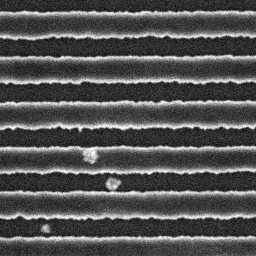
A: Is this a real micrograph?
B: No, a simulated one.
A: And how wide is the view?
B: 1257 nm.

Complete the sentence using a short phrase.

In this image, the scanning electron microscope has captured lines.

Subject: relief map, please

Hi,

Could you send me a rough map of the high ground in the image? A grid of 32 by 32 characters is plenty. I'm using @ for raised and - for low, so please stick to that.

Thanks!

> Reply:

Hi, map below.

--------------------------------
---@-----@@@------@----@@@-@@@@@
@@@@@@@@@@@@@@@@@@@@@@@@@@@@@@@@
@@@@@@@@@@@@@@@@@@@@@@@@@@@@@@@@
@@@@@@@@@@@@@@@@@@-@-@@@@@@@-@-@
--------------------------------
--------------------------------
@@@@@@@@@@@@@@@@@@@@@@@@@@@@@@@@
@@@@@@@@@@@@@@@@@@@@@@@@@@@@@@@@
@@@@@@@@@@@@@@@@@@@@@@@@@@@@@@@@
--------------------------------
--------------------------------
--------------------------------
@@@@@@@@@@@@@@@@@@@@@@@@@@@@@@@@
@@@@@@@@@@@@@@@@@@@@@@@@@@@@@@@@
@@@@@@@@@@@@@@@@@@@@@@@@@@@@@@@@
--------------------------------
--------------------------------
@@@@@@@@@@@@@@@@@@@@@@@@@@@@@@@@
@@@@@@@@@@@@@@@@@@@@@@@@@@@@@@@@
@@@@@@@@@@@@@@@@@@@@@@@@@@@@@@@@
@@@@@@@@@@@@@@@@@@@@@@@@@@@@@---
--------------------------------
--------------------------------
@@@@@@@@@@@@@@@@@@@@@@@@@@@@@@@@
@@@@@@@@@@@@@@@@@@@@@@@@@@@@@@@@
@@@@@@@@@@@@@@@@@@@@@@@@@@@@@@@@
--------------------------------
--------------------------------
--------------------------------
@@@@@@@@@@@@@@@@@@@@@@@@@@@@@@@@
@@@@@@@@@@@@@@@@@@@@@@@@@@@@@@@@